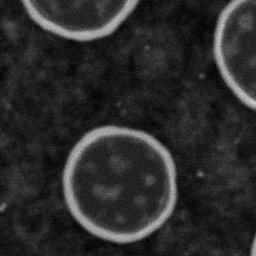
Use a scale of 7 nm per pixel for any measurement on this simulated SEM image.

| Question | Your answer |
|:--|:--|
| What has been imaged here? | raised bodies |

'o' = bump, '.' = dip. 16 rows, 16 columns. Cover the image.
..oooooo......oo
...oooo.......oo
..............oo
..............oo
..............oo
...............o
................
................
......ooo.......
.....ooooo......
....ooooooo.....
....ooooooo.....
....ooooooo.....
.....ooooo......
......ooo.......
................